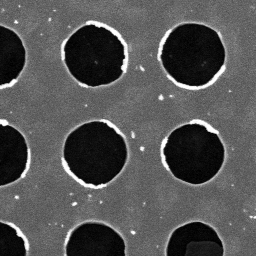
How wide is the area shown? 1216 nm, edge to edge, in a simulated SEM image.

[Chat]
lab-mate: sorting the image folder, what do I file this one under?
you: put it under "holes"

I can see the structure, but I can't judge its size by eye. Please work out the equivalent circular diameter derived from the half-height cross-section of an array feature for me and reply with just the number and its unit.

292 nanometres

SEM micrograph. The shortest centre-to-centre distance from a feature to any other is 0.464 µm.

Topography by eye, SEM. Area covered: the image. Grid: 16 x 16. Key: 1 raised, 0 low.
1111111111111111
1111111111111111
0111000111000011
0011000011000011
0111000011100011
1111111111111111
1111111111111111
1111111111111111
0111000011100111
0011000011000011
0011000011100011
1111111111111111
1111111111111111
1111111111111111
0111100111100111
0011000011000011